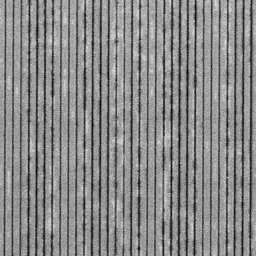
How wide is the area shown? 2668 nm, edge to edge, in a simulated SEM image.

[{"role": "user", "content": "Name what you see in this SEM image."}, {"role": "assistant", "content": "parallel lines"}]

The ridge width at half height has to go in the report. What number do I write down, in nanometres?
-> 61.2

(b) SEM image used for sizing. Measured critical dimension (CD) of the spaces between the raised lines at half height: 20.8 nm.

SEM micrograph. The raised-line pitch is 82.6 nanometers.